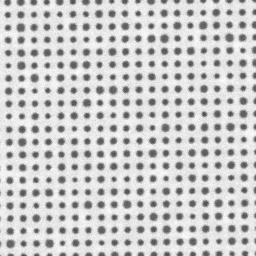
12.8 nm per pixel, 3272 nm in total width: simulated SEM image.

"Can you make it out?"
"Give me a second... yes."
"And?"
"a regular array of holes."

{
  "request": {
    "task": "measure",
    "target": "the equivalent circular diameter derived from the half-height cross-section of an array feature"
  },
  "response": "95.7 nanometres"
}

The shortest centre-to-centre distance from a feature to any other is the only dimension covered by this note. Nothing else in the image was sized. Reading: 160 nanometres